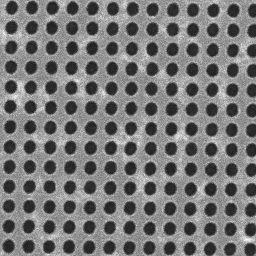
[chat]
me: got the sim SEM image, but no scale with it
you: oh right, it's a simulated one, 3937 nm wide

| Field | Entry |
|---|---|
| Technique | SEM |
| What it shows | a regular array of holes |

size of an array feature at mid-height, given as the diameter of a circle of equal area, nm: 210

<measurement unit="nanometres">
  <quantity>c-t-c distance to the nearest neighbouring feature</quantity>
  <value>304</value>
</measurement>